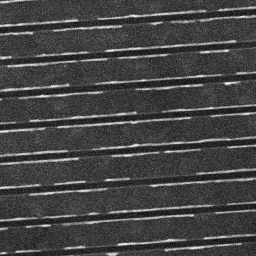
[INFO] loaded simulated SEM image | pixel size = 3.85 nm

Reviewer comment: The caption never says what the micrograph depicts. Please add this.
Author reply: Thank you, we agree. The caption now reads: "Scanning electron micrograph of parallel lines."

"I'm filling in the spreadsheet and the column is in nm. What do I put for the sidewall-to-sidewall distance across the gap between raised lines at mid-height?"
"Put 24.9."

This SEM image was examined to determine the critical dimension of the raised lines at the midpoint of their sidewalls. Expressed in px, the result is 25.4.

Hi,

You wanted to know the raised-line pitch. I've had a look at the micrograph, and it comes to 0.124 micrometres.